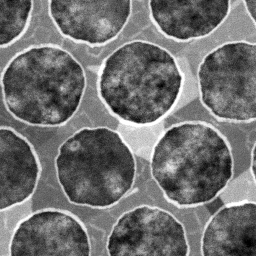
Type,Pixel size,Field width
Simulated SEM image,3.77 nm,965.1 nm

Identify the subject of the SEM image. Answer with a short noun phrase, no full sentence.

holes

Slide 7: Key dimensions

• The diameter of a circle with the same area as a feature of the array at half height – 305 nm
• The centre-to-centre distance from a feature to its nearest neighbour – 0.362 µm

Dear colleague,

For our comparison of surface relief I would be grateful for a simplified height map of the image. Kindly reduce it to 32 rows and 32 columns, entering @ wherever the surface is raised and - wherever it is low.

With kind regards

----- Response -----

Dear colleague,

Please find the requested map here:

----@@----------@@@----------@@-
----@@----------@@@----------@@-
---@@@@---------@@@---------@@@@
---@@@@--------@@@@@-------@@@@@
--@@@@@@------@@@@@@@-----@@@@@@
-@@@@@@@@@@@-@@@---@@@@@@@@@---@
@@@-----@@@@@@-------@@@@@------
@@-------@@@@---------@@@-------
@---------@@@---------@@@-------
-----------@@----------@@-------
-----------@-----------@@-------
----------@@----------@@@-------
@---------@@@---------@@@-------
@---------@@@@-------@@@@@------
@@-------@@@@@@-----@@@@@@@-----
@@@@---@@@@@@@@@@-@@@@@--@@@@@@@
--@@@@@@@@----@@@@@@@------@@@@@
---@@@@@-------@@@@@--------@@@@
----@@@@--------@@@----------@@@
----@@@----------@@----------@@@
-----@@----------@@----------@@@
-----@@----------@@----------@@@
-----@@----------@@----------@@@
----@@@@--------@@@@--------@@@@
----@@@@-------@@@@@@------@@@@@
--@@@@@@@@----@@@@@@@@---@@@@@--
@@@@@---@@@@@@@@-----@@@@@@-----
@@@------@@@@@@-------@@@@------
@@--------@@@@---------@@@------
@@---------@@@---------@@-------
@----------@@----------@@-------
@----------@@@---------@@-------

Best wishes